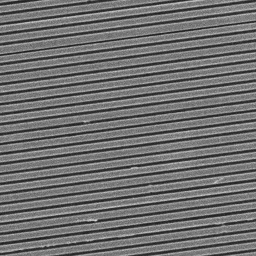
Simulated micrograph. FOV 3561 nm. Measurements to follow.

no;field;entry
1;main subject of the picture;parallel lines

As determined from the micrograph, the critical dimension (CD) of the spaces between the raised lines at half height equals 48.3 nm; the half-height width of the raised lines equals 96.6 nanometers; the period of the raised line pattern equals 138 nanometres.